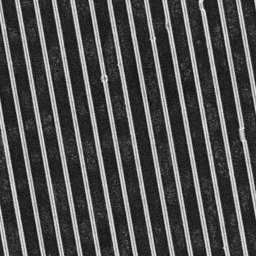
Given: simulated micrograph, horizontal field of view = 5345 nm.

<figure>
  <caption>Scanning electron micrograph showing parallel lines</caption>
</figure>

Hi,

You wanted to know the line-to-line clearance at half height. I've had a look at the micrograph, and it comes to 0.308 microns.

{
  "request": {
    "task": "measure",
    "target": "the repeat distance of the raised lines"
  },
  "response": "378 nm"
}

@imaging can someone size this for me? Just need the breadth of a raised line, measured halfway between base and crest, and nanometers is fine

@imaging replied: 61.6